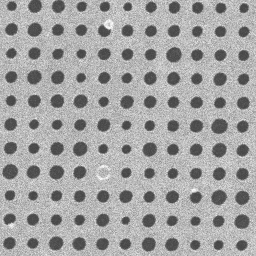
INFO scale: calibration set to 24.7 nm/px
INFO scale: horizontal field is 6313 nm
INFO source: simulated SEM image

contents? a regular array of holes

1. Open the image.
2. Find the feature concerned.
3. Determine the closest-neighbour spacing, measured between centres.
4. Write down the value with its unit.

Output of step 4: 567 nm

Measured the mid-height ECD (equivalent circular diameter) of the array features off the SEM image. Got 304 nanometers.